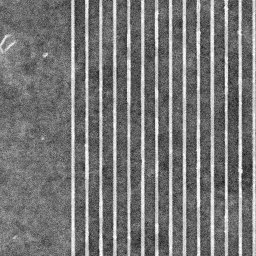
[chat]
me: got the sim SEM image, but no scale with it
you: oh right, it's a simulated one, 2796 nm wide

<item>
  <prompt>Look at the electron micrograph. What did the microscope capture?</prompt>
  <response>parallel lines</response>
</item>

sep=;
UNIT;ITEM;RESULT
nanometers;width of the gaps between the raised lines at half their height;128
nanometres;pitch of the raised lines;152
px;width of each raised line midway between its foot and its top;1.88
